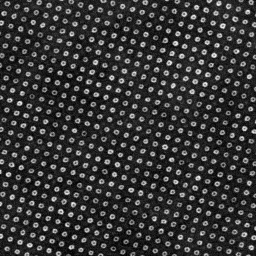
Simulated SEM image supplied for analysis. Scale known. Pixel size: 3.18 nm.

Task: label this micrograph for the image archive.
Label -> a regular array of raised bodies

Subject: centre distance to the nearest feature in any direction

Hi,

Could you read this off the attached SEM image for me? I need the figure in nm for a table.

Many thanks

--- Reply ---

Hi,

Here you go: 31.6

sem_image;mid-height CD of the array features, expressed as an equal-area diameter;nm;13.4